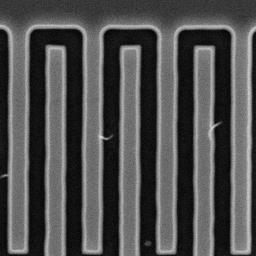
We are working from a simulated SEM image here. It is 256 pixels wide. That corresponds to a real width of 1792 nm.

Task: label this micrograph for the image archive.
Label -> groups of lines, slits or small figures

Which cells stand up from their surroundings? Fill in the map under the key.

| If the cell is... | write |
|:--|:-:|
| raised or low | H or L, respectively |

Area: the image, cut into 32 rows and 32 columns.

HHHHHHHHHHHHHHHHHHHHHHHHHHHHHHHH
HHHHHHHHHHHHHHHHHHHHHHHHHHHHHHHH
HHHHHHHHHHHHHHHHHHHHHHHHHHHHHHHH
HHHHLLLLLLHHHHLLLLLHHHHLLLLLHHHH
LHHHLLLLLLHHHLLLLLLLHHLLLLLLLHHL
LHHLLLLLLLLHHLLLLLLLHHLLLLLLLHHL
LHHLLLHHLLLHHLLHHLLLHHLLHHHLLHHL
LHHLLLHHLLLHHLLHHLLLHHLLHHHLLHHL
LHHLLLHHLLLHHLLHHLLLHHLLHHHLLHHL
LHHLLLHHLLLHHLLHHLLLHHLLHHHLLHHL
LHHLLLHHLLLHHLLHHLLLHHLLHHHLLHHL
LHHLLLHHLLLHHLLHHLLLHHLLHHHLLHHL
LHHLLLHHLLLHHLLHHLLLHHLLHHHLLHHL
LHHLLLHHLLLHHLLHHLLLHHLLHHHLLHHL
LHHLLLHHLLLHHLLHHLLLHHLLHHHLLHHL
LHHLLLHHLLLHHLLHHLLLHHLLHHHLLHHL
LHHLLLHHLLHHHLLHHLLLHHLLHHHLLHHL
LHHLLLHHLLHHHLLHHLLLHHLLHHHLLHHL
LHHLLLHHLLHHHLLHHLLLHHLLHHHLLHHL
LHHLLLHHLLHHHLLHHLLLHHLLHHHLLHHL
LHHLLLHHLLHHHLLHHLLLHHLLHHHLLHHL
LHHLLLHHLLHHHLLHHLLLHHLLHHHLLHHL
LHHLLLHHLLHHHLLHHLLLHHLLHHHLLHHL
LHHLLLHHLLHHHLLHHLLLHHLLHHHLLHHL
LHHLLLHHLLHHHLLHHLLLHHLLHHHLLHHL
LHHLLLHHLLHHHLLHHLLLHHLLHHHLLHHL
LHHLLLHHLLHHHLLHHLLLHHLLHHHLLHHL
LHHLLLHHLLHHHLLHHLLLHHLLHHHLLHHL
LHHLLLHHLLHHHLLHHLLLHHLLHHHLLHHL
LHHLLLHHLLLHHLLHHLLLHHLLHHHLLHHL
LHHLLLHHLLHHHLLHHLLLHHLLHHHLLHHL
LLHLLLHHLLLHLLLHHLLLHLLLHHHLLHHL